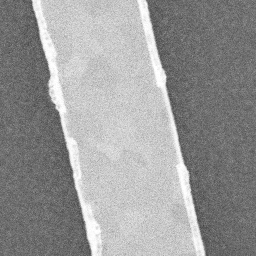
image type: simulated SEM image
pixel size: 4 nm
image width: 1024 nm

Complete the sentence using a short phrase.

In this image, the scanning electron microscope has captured one or a few lines or trenches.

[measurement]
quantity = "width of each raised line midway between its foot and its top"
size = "0.429 micrometres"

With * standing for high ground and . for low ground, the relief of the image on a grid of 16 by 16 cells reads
..*******.......
..*******.......
...*******......
...*******......
...*******......
...*******......
...*******......
....*******.....
....*******.....
....*******.....
.....*******....
.....*******....
.....*******....
.....*******....
......******....
......*******...